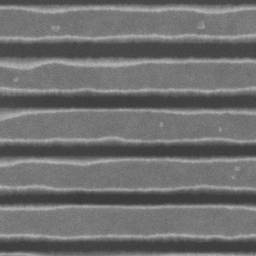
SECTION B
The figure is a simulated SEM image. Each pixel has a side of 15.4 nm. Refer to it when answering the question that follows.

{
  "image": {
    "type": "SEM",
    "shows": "lines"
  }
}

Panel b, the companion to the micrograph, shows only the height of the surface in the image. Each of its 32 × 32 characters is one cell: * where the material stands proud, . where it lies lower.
................................
********************************
********************************
********************************
********************************
................................
................................
.....***.........***************
********************************
********************************
********************************
.*********.*******************..
................................
................................
********************************
********************************
********************************
********************************
................................
................................
********************************
********************************
********************************
********************************
................................
................................
********************************
********************************
********************************
********************************
................................
................................